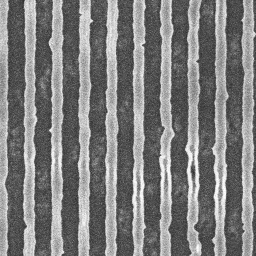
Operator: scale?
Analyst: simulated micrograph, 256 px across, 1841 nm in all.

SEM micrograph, parallel lines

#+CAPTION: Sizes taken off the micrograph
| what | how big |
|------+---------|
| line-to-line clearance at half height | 0.127 micrometres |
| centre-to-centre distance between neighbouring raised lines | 196 nanometers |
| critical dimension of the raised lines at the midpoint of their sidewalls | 73.7 nm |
